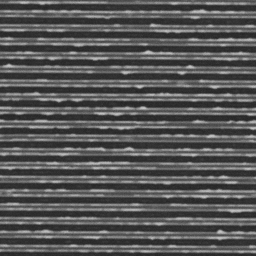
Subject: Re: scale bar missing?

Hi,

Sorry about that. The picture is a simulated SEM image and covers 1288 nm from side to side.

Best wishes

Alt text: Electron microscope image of parallel lines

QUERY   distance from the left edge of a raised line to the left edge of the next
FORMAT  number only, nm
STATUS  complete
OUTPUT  69.4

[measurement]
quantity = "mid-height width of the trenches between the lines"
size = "34.6 nanometers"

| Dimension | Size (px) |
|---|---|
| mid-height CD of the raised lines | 6.88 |